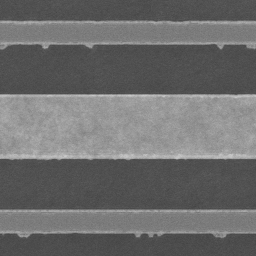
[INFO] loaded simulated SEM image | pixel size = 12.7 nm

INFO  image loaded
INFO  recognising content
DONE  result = lines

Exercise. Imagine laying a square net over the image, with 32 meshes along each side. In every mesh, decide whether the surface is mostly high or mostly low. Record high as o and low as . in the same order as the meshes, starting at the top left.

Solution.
................................
................................
................................
oooooooooooooooooooooooooooooooo
oooooooooooooooooooooooooooooooo
................................
................................
................................
................................
................................
................................
................................
oooooooooooooooooooooooooooooooo
oooooooooooooooooooooooooooooooo
oooooooooooooooooooooooooooooooo
oooooooooooooooooooooooooooooooo
oooooooooooooooooooooooooooooooo
oooooooooooooooooooooooooooooooo
oooooooooooooooooooooooooooooooo
oooooooooooooooooooooooooooooooo
................................
................................
................................
................................
................................
................................
oooooooooooooooooooooooooooooooo
oooooooooooooooooooooooooooooooo
oooooooooooooooooooooooooooooooo
................................
................................
................................